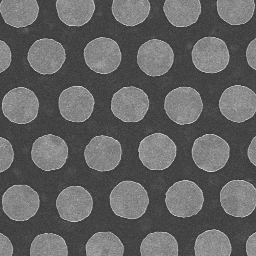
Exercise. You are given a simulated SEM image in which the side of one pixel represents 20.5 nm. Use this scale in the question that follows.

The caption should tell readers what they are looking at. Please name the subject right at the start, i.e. a regular array of raised bodies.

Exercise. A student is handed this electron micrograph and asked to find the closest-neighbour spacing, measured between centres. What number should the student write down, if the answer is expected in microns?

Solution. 1.09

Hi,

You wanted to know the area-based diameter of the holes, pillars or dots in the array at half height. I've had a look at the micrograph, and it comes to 754 nanometres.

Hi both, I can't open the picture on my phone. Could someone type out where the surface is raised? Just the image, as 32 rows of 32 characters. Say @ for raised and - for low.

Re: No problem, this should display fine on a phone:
@@@@@--@@@@@--@@@@@--@@@@--@@@@@
@@@@@--@@@@@--@@@@@--@@@@--@@@@@
-@@@----@@@----@@@---@@@@---@@@-
--------------------------------
--------------------------------
@---@@@----@@@@---@@@----@@@---@
@---@@@@---@@@@--@@@@@--@@@@@--@
@---@@@@---@@@@--@@@@@--@@@@@--@
@---@@@----@@@@---@@@----@@@----
--------------------------------
--------------------------------
-@@@----@@@----@@@---@@@@---@@@@
@@@@@--@@@@@--@@@@@--@@@@---@@@@
@@@@@--@@@@@--@@@@---@@@@--@@@@@
-@@@----@@@----@@@---@@@@---@@@-
--------------------------------
--------------------------------
@----@@@---@@@----@@@----@@@----
@@--@@@@---@@@@--@@@@@--@@@@@--@
@@--@@@@---@@@@--@@@@@--@@@@@--@
@---@@@@---@@@@---@@@----@@@----
--------------------------------
--------------------------------
-@@@----@@----@@@@---@@@@---@@@@
@@@@@--@@@@---@@@@---@@@@---@@@@
@@@@@--@@@@---@@@@---@@@@---@@@@
-@@@---@@@@---@@@@---@@@@---@@@-
--@-----@@----------------------
--------------------------------
@----@@-----@@----@@@----@@@---@
@---@@@@---@@@@---@@@@--@@@@@--@
@@--@@@@---@@@@---@@@@--@@@@@--@